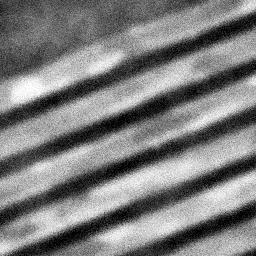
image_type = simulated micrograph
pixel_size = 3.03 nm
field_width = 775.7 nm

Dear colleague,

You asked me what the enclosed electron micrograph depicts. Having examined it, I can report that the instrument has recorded parallel lines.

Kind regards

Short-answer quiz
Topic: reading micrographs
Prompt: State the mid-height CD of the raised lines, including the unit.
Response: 74.1 nm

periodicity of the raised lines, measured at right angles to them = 0.134 um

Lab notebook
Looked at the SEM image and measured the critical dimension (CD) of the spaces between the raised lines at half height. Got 0.0586 µm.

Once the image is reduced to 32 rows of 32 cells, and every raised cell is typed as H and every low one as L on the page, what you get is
LLLLLLLLLLLLLLLLLLLLLLLLLLHHHHHH
LLLLLLLLLLLLLLLLLLLLLLLHHHHHHHHL
LLLLLLLLLLLLLLLLLLLLHHHHHHHHLLLL
LLLLLLLLLLLLLLLLLHHHHHHHHHLLLLLL
LLLLLLLLLLLLLLLHHHHHHHHHLLLLLLHH
LLLLLLLLLLLLLHHHHHHHHLLLLLLHHHHH
LLLLLLLLLLHHHHHHHHLLLLLLLHHHHHHH
LLLLLLLLHHHHHHHHLLLLLLLHHHHHHHHL
LLLLLHHHHHHHHHLLLLLLHHHHHHHHLLLL
LLLHHHHHHHHLLLLLLLHHHHHHHHLLLLLL
HHHHHHHHHLLLLLLHHHHHHHHLLLLLLLHH
HHHHHHLLLLLLLHHHHHHHHLLLLLLHHHHH
HHHHLLLLLLHHHHHHHHLLLLLLLHHHHHHH
HLLLLLLLHHHHHHHHLLLLLLHHHHHHHHHL
LLLLLHHHHHHHHLLLLLLLHHHHHHHHLLLL
LLLHHHHHHHHLLLLLLHHHHHHHHHLLLLLL
HHHHHHHHHLLLLLLHHHHHHHHLLLLLLLHH
HHHHHHLLLLLLLHHHHHHHHLLLLLLHHHHH
HHHLLLLLLLHHHHHHHHLLLLLLLHHHHHHH
HLLLLLLHHHHHHHHHLLLLLLHHHHHHHHHL
LLLLLHHHHHHHHLLLLLLLHHHHHHHHLLLL
LLLHHHHHHHHLLLLLLHHHHHHHHHLLLLLL
HHHHHHHHLLLLLLLHHHHHHHHLLLLLLLHH
HHHHHHLLLLLLHHHHHHHHHLLLLLLHHHHH
HHHLLLLLLLHHHHHHHHLLLLLLLHHHHHHH
HLLLLLLHHHHHHHHHLLLLLLHHHHHHHHLL
LLLLLHHHHHHHHLLLLLLLHHHHHHHHLLLL
LLHHHHHHHHHLLLLLLHHHHHHHHHLLLLLL
HHHHHHHHLLLLLLLHHHHHHHHLLLLLLLHH
HHHHHHLLLLLLHHHHHHHHLLLLLLLHHHHH
HHHLLLLLLLHHHHHHHHLLLLLLLHHHHHHH
HLLLLLLHHHHHHHHLLLLLLLHHHHHHHHLL